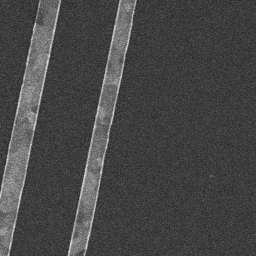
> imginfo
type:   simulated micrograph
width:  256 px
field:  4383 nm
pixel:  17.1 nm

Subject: one or a few lines or trenches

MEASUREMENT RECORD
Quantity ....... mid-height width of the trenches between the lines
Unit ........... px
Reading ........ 58.3